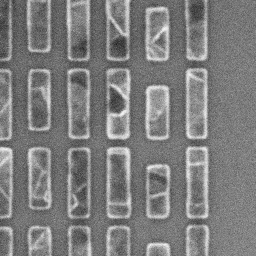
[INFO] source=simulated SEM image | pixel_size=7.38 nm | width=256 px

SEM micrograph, wiring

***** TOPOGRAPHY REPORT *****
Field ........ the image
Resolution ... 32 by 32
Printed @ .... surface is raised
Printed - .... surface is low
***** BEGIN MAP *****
@---@@---@@--@@@-------@@@------
@---@@---@@--@@@--@@@--@@@------
@---@@---@@---@@--@@@--@@@------
@---@@---@@---@@--@@@--@@@------
@---@@---@@---@@--@@@--@@@------
@---@@---@@---@@--@@@--@@@------
@--------@@---@@--@@@--@@@------
--------------------------------
--------------------------------
@---@@---@@---@@-------@@@------
@---@@---@@---@@-------@@@------
@---@@---@@---@@--@@@--@@@------
@---@@---@@---@@--@@@--@@@------
@---@@---@@---@@--@@@--@@@------
@---@@---@@---@@--@@@--@@@------
@---@@---@@---@@--@@@--@@@------
@--------@@---@@--@@@--@@@------
--------------------------------
--------------------------------
@---@@---@@---@@-------@@@------
@---@@---@@---@@-------@@@------
@---@@---@@---@@--@@@--@@@------
@---@@---@@---@@--@@@--@@@------
@---@@---@@---@@--@@@---@@------
@---@@---@@---@@--@@@---@@------
@---@@---@@---@@--@@@--@@@------
@--------@@---@@--@@@--@@@------
--------------------------------
----@----@@---@@--------@@------
@---@@---@@---@@-------@@@------
@---@@---@@---@@-------@@@------
@---@@---@@---@@--@@@--@@@------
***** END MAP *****